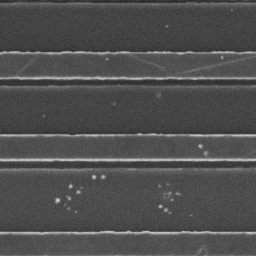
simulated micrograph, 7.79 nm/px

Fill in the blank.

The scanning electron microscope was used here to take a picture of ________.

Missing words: lines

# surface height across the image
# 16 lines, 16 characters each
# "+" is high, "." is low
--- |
................
................
................
++++++++++++++++
++++++++++++++++
................
................
................
++++++++++++++++
++++++++++++++++
................
................
................
................
......+.++.++...
++++++++++++++++